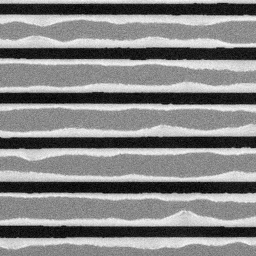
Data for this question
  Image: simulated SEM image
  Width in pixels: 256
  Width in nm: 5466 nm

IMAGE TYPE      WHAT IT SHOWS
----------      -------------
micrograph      lines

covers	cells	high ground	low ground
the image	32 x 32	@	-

--------------------------------
--------------------------------
@@@@@@@@@@@@@@@@@@@@@@@@@@@@@@@@
@@@@@@@@@@@@@@@@@@@@@@@@@@@@@@@@
@@@@@@@@@@@@@@@@@@@@@@@@@@@@@@@@
@@@@--@@@@@@@@@@@@--@@@@@@@@@@@@
--------------------------------
--------------------------------
@@@@@@@@@@@@@@@@@@@@@@@@@@@@@@@@
@@@@@@@@@@@@@@@@@@@@@@@@@@@@@@@@
@@@@@@@@@@@@@@@@@@@@@@@@@@@@@@@@
--------------------------------
--------------------------------
@@@@@@@@@@@@@@@@@@@@@@@@@@@@@@@@
@@@@@@@@@@@@@@@@@@@@@@@@@@@@@@@@
@@@@@@@@@@@@@@@@@@@@@@@@@@@@@@@@
@@@@@@@@@@@@@@@@@@@@@@@@@@@@@@@-
--------------------------------
--------------------------------
@@@@@@@@@@@@@@@@@@@@@@@@@@@@@@@@
@@@@@@@@@@@@@@@@@@@@@@@@@@@@@@@@
@@@@@@@@@@@@@@@@@@@@@@@@@@@@@@@@
----------------------@@@-------
--------------------------------
@@@@@@@@@@@@@@@@@@@@@@-@@@@-----
@@@@@@@@@@@@@@@@@@@@@@@@@@@@@@@@
@@@@@@@@@@@@@@@@@@@@@@@@@@@@@@@@
@@@@@@@@@@@@@@@@@@@@@@@@@@@@@@@@
--------------------------------
--------------------------------
@@@@@@@@@@@@@@@@@@@@@@@@@@@@@@@@
@@@@@@@@@@@@@@@@@@@@@@@@@@@@@@@@